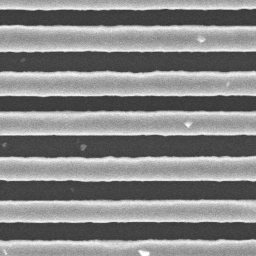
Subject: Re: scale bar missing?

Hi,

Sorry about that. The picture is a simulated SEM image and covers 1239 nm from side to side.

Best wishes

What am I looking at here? lines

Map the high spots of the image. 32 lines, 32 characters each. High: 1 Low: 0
11111111111111111111111111111111
00000000000000000000000000000000
00000000000000000000000000000000
11111111111111111111111111111111
11111111111111111111111111111111
11111111111111111111111111111111
11111100100001001100101101000000
00000000000000000000000000000000
00000000000000000000000000000000
11111111111111111111111111111111
11111111111111111111111111111111
11111111111111111111111111111111
00000000000000000000000000000000
00000000000000000000000000000000
11111111111111111111111111111111
11111111111111111111111111111111
11111111111111111111111111111111
00000000000000000000000000000000
00000000000000000000000000000000
00000000000000000000000000000000
11111111111111111111111111111111
11111111111111111111111111111111
11111111111111111111111111111111
00000000000000000000000000000000
00000000000000000000000000000000
11111111111111111111111111111111
11111111111111111111111111111111
11111111111111111111111111111111
00000000000000000000000000000000
00000000000000000000000000000000
11111111111111111111111111111111
11111111111111111111111111111111